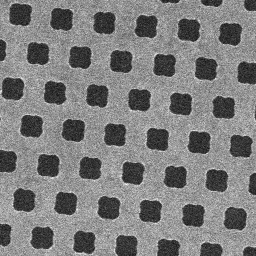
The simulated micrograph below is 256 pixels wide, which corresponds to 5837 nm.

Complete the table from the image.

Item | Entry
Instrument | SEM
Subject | a regular array of holes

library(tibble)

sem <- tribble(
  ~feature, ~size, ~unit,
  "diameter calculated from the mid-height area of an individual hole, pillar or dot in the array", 551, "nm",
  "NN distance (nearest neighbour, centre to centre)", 951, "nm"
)